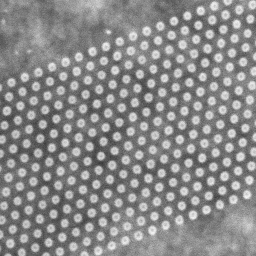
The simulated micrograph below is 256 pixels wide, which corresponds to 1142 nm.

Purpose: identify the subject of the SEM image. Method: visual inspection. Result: a regular array of raised bodies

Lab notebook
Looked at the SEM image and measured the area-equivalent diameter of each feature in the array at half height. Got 32.7 nm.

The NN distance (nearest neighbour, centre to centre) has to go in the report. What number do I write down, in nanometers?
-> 63.5